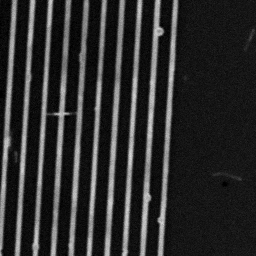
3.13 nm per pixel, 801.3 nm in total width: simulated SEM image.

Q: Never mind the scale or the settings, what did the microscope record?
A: parallel lines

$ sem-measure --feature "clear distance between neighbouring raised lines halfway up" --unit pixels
14.3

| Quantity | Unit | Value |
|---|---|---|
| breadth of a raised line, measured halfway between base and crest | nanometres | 11.7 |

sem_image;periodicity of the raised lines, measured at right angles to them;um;0.0559